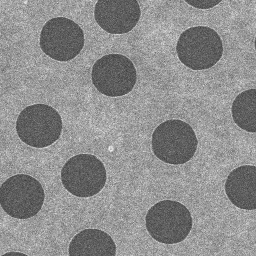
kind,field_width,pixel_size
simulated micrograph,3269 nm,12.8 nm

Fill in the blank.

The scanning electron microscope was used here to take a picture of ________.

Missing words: holes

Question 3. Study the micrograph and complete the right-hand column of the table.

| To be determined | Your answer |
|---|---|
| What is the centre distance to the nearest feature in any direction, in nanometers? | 855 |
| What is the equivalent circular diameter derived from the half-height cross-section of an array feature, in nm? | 584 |